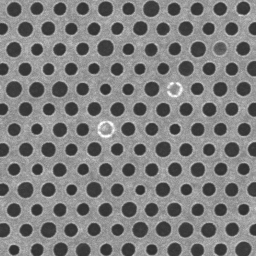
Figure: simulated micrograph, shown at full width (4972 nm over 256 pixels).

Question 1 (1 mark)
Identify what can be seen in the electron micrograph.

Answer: a regular array of holes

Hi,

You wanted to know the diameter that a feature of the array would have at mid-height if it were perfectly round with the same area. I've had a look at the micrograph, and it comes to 266 nanometres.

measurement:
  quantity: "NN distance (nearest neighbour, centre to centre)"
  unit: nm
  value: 440